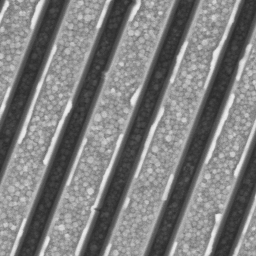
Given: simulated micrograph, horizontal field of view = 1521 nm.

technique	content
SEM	parallel lines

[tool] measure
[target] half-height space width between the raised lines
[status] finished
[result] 20 pixels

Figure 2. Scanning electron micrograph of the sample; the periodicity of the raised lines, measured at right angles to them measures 0.361 µm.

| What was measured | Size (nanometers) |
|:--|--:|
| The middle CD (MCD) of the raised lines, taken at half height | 238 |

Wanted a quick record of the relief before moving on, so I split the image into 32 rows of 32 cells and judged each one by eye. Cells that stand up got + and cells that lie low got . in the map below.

++++++..++++++...+++++...+++++..
+++++...+++++...++++++..++++++..
+++++...+++++...+++++...+++++...
++++...++++++..++++++...+++++...
++++...+++++...+++++...++++++..+
++++...+++++...+++++...+++++...+
+++...+++++...++++++..++++++..++
+++...+++++...+++++...+++++...++
+++..++++++...+++++...+++++...++
++...+++++...+++++...++++++..+++
++...+++++...+++++...+++++...+++
+...++++++..++++++..++++++...+++
+...+++++...+++++...+++++...++++
+...+++++...+++++...+++++...++++
...+++++...++++++..++++++..+++++
...+++++...+++++...+++++...+++++
..++++++...+++++...+++++...+++++
..+++++...+++++...++++++..++++++
..+++++...+++++...+++++...+++++.
.++++++..++++++...+++++...+++++.
.+++++...+++++...+++++...++++++.
++++++...+++++...+++++...+++++..
+++++...++++++..++++++..++++++..
+++++...+++++...+++++...+++++...
+++++..++++++...+++++...+++++...
++++...+++++...++++++..++++++..+
++++...+++++...+++++...+++++...+
++++..++++++..++++++...+++++...+
+++...+++++...+++++...++++++..++
+++...+++++...+++++...+++++...++
++...++++++..++++++..++++++...++
++...+++++...+++++...+++++...+++